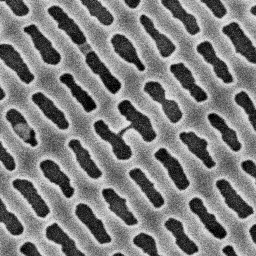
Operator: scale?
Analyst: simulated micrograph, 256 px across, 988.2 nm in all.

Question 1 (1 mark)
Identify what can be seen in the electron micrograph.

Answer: a regular array of holes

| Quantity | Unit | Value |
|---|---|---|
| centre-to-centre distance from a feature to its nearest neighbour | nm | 125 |